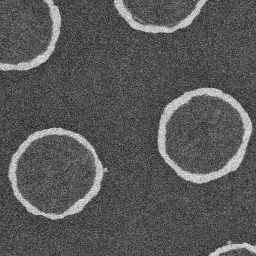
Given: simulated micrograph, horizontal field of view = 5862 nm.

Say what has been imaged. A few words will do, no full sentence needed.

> raised bodies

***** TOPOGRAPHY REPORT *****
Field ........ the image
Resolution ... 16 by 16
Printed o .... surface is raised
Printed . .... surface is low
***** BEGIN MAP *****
ooo.....oooo....
oooo....ooo.....
ooo.............
ooo.............
................
................
...........oooo.
..........ooooo.
..ooo.....ooooo.
.ooooo....ooooo.
.ooooo.....ooo..
.ooooo..........
.oooo...........
...o............
................
..............oo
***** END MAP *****